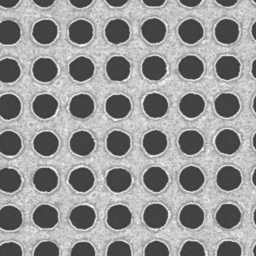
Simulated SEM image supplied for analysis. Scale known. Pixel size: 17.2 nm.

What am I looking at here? a regular array of holes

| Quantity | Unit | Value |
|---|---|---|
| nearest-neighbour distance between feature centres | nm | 623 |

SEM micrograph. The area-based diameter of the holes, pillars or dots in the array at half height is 436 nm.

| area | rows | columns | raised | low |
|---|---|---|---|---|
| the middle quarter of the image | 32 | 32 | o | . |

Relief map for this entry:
o.......oo.......oo.......oo....
o.......oo.......oo.......ooo...
o......oooo.....oooo.....oooo...
oo....ooooo.....ooooo...oooooo..
oooooooooooooooooooooooooooooooo
oooooooooooooooooooooooooooooooo
oooooooooooooooooooooooooooooooo
oooo..ooooooooooooooo...ooooooo.
oo.....oooo.....oooo.....oooo...
o......ooo.......ooo......ooo...
o.......oo.......ooo......ooo...
o......ooo.......ooo......ooo...
oo.....oooo.....ooooo....ooooo..
oooo.ooooooo...ooooooo.ooooooooo
oooooooooooooooooooooooooooooooo
oooooooooooooooooooooooooooooooo
oooooooooooooooooooooo..ooooooo.
oo.....oooo.....oooo.....oooo...
oo.....oooo......ooo......ooo...
o.......ooo......ooo......ooo...
o.......ooo......ooo......ooo...
oo.....oooo.....oooo.....oooo...
ooo...oooooo...oooooo...oooooo..
oooooooooooooooooooooooooooooooo
oooooooooooooooooooooooooooooooo
ooooooooooooooooooooooooooooooo.
oo....oooooo...oooooo....ooooo..
oo.....oooo......ooo......ooo...
o.......ooo......ooo......ooo...
o.......ooo......ooo......ooo...
oo.....oooo......ooo......ooo...
ooo...oooooo....ooooo....ooooo..